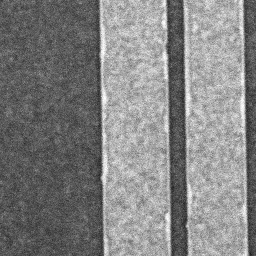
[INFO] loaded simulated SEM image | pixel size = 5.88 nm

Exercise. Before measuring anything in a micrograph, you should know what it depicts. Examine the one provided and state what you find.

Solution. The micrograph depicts one or a few lines or trenches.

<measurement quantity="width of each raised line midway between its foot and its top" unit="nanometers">358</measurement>